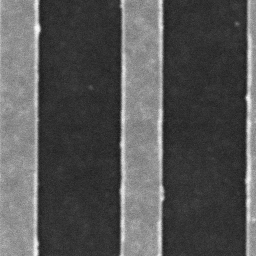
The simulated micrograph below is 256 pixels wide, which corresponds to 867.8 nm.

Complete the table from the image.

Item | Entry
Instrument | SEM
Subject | one or a few lines or trenches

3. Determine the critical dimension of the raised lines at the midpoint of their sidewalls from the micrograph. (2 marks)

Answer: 0.134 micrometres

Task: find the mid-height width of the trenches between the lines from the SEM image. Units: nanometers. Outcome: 288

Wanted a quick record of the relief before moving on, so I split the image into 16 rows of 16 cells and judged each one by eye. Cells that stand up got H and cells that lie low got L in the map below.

HHLLLLLLHHLLLLLL
HHLLLLLLHHLLLLLL
HHLLLLLLHHLLLLLL
HHLLLLLLHHLLLLLL
HHLLLLLLHHLLLLLL
HHLLLLLLHHLLLLLL
HHLLLLLLHHLLLLLH
HHLLLLLLHHLLLLLH
HHLLLLLLHHLLLLLH
HHLLLLLLHHLLLLLH
HHLLLLLLHHLLLLLH
HHLLLLLLHHLLLLLH
HHLLLLLLHHLLLLLH
HHLLLLLLHHLLLLLH
HHLLLLLLHHLLLLLH
HHLLLLLLHHLLLLLH